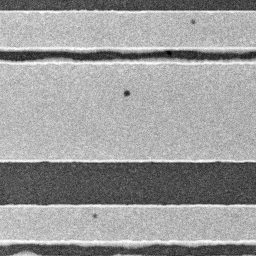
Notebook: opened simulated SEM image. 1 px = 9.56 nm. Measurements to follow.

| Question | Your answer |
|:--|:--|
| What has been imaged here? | lines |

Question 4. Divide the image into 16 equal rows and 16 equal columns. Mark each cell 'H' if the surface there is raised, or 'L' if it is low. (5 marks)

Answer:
LLLLLLLLLLLLLLLL
HHHHHHHHHHHHHHHH
HHHHHHHHHHHHHHHH
HHHHHHHHHHHHHHHH
HHHHHHHHHHHHHHHH
HHHHHHHHHHHHHHHH
HHHHHHHHHHHHHHHH
HHHHHHHHHHHHHHHH
HHHHHHHHHHHHHHHH
HHHHHHHHHHHHHHHH
LLLLLLLLLLLLLLLL
LLLLLLLLLLLLLLLL
LLLLLLLLLLLLLLLL
HHHHHHHHHHHHHHHH
HHHHHHHHHHHHHHHH
HHHHHHHHHHHHHHHH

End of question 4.